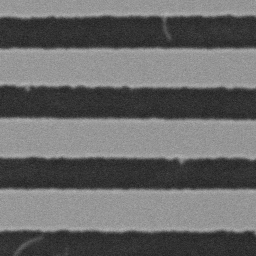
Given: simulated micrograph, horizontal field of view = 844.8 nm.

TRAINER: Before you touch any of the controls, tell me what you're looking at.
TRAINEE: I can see lines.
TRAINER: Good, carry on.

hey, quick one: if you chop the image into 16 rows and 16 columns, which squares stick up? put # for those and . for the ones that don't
################
................
................
################
################
...............#
................
##############..
################
################
................
................
################
################
................
................